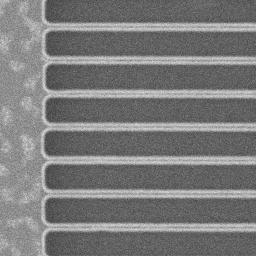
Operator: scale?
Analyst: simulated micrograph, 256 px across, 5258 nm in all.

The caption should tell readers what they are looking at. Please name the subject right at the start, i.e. parallel lines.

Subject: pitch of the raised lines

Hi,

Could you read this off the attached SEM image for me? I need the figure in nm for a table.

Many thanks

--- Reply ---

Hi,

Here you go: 686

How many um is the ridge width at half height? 0.113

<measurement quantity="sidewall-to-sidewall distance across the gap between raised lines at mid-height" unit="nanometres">570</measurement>